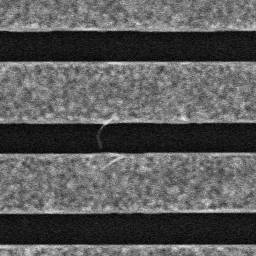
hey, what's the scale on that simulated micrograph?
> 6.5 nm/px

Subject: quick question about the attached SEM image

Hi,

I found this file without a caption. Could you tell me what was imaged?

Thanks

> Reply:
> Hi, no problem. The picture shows lines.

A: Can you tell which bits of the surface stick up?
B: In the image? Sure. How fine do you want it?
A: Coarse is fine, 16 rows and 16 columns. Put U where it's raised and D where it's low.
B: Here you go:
UUUUUUUUUUUUUUUU
UUUUUUUUUUUUUUUU
DDDDDDDDDDDDDDDD
DDDDDDDDDDDDDDDD
UUUUUUUUUUUUUUUU
UUUUUUUUUUUUUUUU
UUUUUUUUUUUUUUUU
UUUUUUUUUUUUUUUU
DDDDDDDDDDDDDDDD
DDDDDDDDDDDDDDDD
UUUUUUUUUUUUUUUU
UUUUUUUUUUUUUUUU
UUUUUUUUUUUUUUUU
DDDDDDDDDDDDDDDD
DDDDDDDDDDDDDDDD
UUUUUUUUUUUUUUUU